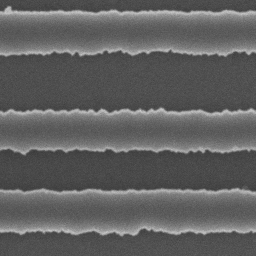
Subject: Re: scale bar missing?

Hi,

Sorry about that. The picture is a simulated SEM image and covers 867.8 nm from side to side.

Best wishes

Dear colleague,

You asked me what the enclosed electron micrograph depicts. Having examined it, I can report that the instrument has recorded lines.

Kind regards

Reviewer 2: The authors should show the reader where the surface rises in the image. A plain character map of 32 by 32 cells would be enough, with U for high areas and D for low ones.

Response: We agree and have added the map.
DDDDDDDDDDDDDDDDDDDDDDDDDDDDDDDD
UUUUUUUUUUUDUUUDUUUUUUUDUUDDUUDU
UUUUUUUUUUUUUUUUUUUUUUUUUUUUUUUU
UUUUUUUUUUUUUUUUUUUUUUUUUUUUUUUU
UUUUUUUUUUUUUUUUUUUUUUUUUUUUUUUU
UUUUUUUUUUUUUUUUUUUUUUUUUUUUUUUU
UUUUUUUUUUUUUDDDUUUDDDUUUUUUUDDU
DDDDDDDDDDDDDDDDDDDDDDDDDDDDDDDD
DDDDDDDDDDDDDDDDDDDDDDDDDDDDDDDD
DDDDDDDDDDDDDDDDDDDDDDDDDDDDDDDD
DDDDDDDDDDDDDDDDDDDDDDDDDDDDDDDD
DDDDDDDDDDDDDDDDDDDDDDDDDDDDDDDD
DDDDDDDDDDDDDDDDDDDDDDDDDDDDDDDD
DDDDDDDDDDDDDDDDDDDDDDDDDDDDDDDD
UUUUUUUUUUUUUUUUUUUUUUUUUUUUUUUU
UUUUUUUUUUUUUUUUUUUUUUUUUUUUUUUU
UUUUUUUUUUUUUUUUUUUUUUUUUUUUUUUU
UUUUUUUUUUUUUUUUUUUUUUUUUUUUUUUU
UUUUUUUUUUUUUUUUUUUUUUUUUUUUUUUU
DDDDDDDDDDDDDDDDDDDDDDDDDDDDDDDD
DDDDDDDDDDDDDDDDDDDDDDDDDDDDDDDD
DDDDDDDDDDDDDDDDDDDDDDDDDDDDDDDD
DDDDDDDDDDDDDDDDDDDDDDDDDDDDDDDD
DDDDDDDDDDDDDDDDDDDDDDDDDDDDDDDD
UUUUUUUUUUUUUUUUUUUUUUUUUUUUUUUU
UUUUUUUUUUUUUUUUUUUUUUUUUUUUUUUU
UUUUUUUUUUUUUUUUUUUUUUUUUUUUUUUU
UUUUUUUUUUUUUUUUUUUUUUUUUUUUUUUU
UUUUUUUUUUUUUUUUUUUUUUUUUUUUUUUU
DDDDDDDDDDDDDDDDDDDDDDDDDDDDDDDD
DDDDDDDDDDDDDDDDDDDDDDDDDDDDDDDD
DDDDDDDDDDDDDDDDDDDDDDDDDDDDDDDD